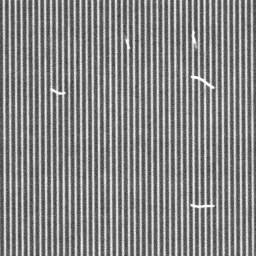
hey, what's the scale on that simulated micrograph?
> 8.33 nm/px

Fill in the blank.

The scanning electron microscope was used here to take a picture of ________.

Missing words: parallel lines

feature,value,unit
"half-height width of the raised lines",9.4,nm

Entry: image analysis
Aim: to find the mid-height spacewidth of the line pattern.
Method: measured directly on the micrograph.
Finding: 0.0406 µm